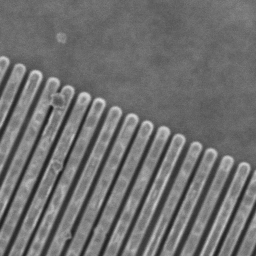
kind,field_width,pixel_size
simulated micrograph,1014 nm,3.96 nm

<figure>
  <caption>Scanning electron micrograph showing parallel lines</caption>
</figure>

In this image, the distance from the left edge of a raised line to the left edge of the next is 0.0685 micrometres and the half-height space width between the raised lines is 23.6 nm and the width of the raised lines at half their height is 47.1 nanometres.